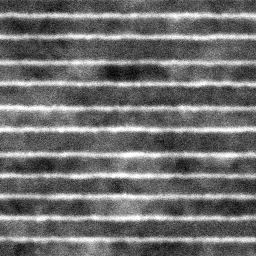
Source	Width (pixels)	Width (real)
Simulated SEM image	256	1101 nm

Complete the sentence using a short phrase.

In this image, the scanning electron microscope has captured lines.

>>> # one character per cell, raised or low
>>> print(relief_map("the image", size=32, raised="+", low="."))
................................
................................
++++++++++++++++++++++++++++++++
++++++++++++++++++++++++++++++++
++++++++++++++++++++++++++++++++
................................
................................
................................
++++++++++++++++++++++++++++++++
++++++++++++++++++++++++++++++++
+.++.+.+++++++++++++++++++++++++
................................
................................
++++++++++++++++++++++++++++++++
++++++++++++++++++++++++++++++++
++++++++++++++++++++++++++++++++
................................
................................
................................
++++++++++++++++++++++++++++++++
++++++++++++++++++++++++++++++++
++++++++++++++++++++++++++++++++
................................
................................
+++++..+++..+++++..+.++++..+++..
++++++++++++++++++++++++++++++++
++++++++++++++++++++++++++++++++
................................
................................
................................
++++++++++++++++++++++++++++++++
++++++++++++++++++++++++++++++++